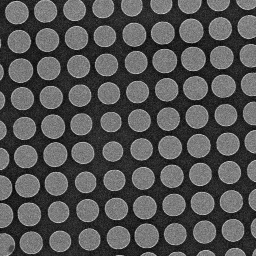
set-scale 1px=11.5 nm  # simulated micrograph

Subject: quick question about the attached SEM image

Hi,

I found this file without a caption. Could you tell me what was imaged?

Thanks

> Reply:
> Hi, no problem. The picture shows an array of small figures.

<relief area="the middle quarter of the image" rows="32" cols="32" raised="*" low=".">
.*****..*****..******..*****..**
.*****..*****...****...****....*
..****...***....................
...............................*
.................***....****..**
...**....****...*****..*****..**
..****...*****..*****..*****..**
.******..*****..*****..*****..**
.******..*****..*****...****...*
..****....***....**.............
...**...........................
..................*.....****...*
....*.....***....****...*****..*
..*****..*****..*****..******.**
..*****..*****..******.******..*
..*****..*****..*****...****....
..*****...***....***.....**.....
...**...........................
.........................***....
............*....****...*****..*
...****...****...*****..*****..*
*.*****...*****..*****..*****..*
*.*****...*****..*****..*****...
*.*****...****....***....***....
...***..........................
..........................**....
..................****...****...
....***...*****..*****..******.*
...*****..*****..******.******.*
*..*****..*****..*****...****...
*..*****..*****...****....**....
....***.....**..................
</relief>